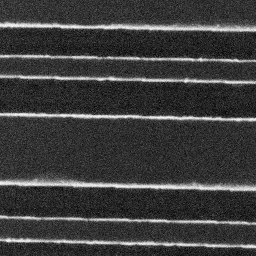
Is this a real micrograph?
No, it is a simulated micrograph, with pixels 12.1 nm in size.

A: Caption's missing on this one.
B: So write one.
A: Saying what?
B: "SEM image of lines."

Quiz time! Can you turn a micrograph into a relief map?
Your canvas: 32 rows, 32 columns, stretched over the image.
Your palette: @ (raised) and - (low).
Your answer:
@@@@@@@@@@@@@@@@@@@@@@@@@@@@@@@@
@@@@@@@@@@@@@@@@@@@@@@@@@@@@@@@@
@@@@@@@@@@@@@@@@@@@@@@@@@@@@@@@@
--------------------@@@@@@@@@@@@
--------------------------------
--------------------------------
--------------------------------
@@@@@@@@@@@@@@@@@@@@@@@@-@------
@@@@@@@@@@@@@@@@@@@@@@@@@@@@@@@@
@@@@@@@@@@@@@@@@@@@@@@@@@@@@@@@@
--------------------------------
--------------------------------
--------------------------------
--------------------------------
@@@@@@@@@@----------------------
@@@@@@@@@@@@@@@@@@@@@@@@@@@@@@@@
@@@@@@@@@@@@@@@@@@@@@@@@@@@@@@@@
@@@@@@@@@@@@@@@@@@@@@@@@@@@@@@@@
@@@@@@@@@@@@@@@@@@@@@@@@@@@@@@@@
@@@@@@@@@@@@@@@@@@@@@@@@@@@@@@@@
@@@@@@@@@@@@@@@@@@@@@@@@@@@@@@@@
@@@@@@@@@@@@@@@@@@@@@@@@@@@@@@@@
@@@@@@@@@@@@@@@@@@@@@@@@@@@@@@@@
-------------------------@@@@@@@
--------------------------------
--------------------------------
--------------------------------
@@@@@@@@@@@@@@@@----------------
@@@@@@@@@@@@@@@@@@@@@@@@@@@@@@@@
@@@@@@@@@@@@@@@@@@@@@@@@@@@@@@@@
----------------@@@@@@@@@@@@@@@@
--------------------------------